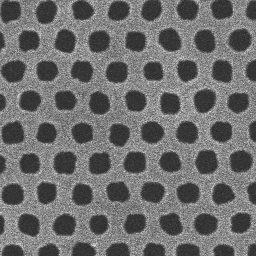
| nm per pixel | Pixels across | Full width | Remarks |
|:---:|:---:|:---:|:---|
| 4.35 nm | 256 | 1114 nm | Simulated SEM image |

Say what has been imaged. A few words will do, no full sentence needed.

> a regular array of holes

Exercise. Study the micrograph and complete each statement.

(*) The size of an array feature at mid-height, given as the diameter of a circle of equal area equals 96.3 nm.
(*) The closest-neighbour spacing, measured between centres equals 148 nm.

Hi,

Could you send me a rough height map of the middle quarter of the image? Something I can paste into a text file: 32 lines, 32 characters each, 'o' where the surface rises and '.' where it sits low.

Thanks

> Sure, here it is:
oo.....oooo.....oooo....oooo....
oo.....oooo.....oooo.....ooo....
oo.....ooo......oooo.....ooo....
oo.....oooo.....oooo.....oooo...
ooooo.oooooo..oooooooooooooooo.o
oooooooooooooooooooooooooooooooo
oooooooooooooooo..oooooooooooooo
..ooooo...oooooo....ooooo...oooo
...oooo....oooo.....oooo.....ooo
...ooo......ooo......ooo.....ooo
...ooo......oooo.....ooo.....ooo
..ooooo....oooooo...oooo.....ooo
oooooooo..ooooooooooooooo...oooo
oooooooooooooooooooooooooooooooo
ooooooooooooooooooooo..ooooooo..
oo.....ooooo....ooo.....ooooo...
oo.....ooooo.....oo......ooo....
oo.....ooooo.....oo......ooo....
oo.....oooo.....ooo......ooo....
ooo...oooooo....oooo....ooooo...
ooooooooooooo..ooooooooooooooooo
oooooooooooooooooooooooooooooooo
..ooooo....ooooo....oooo....oooo
...ooo.....oooo.....oooo.....ooo
...ooo......ooo.....oooo.....ooo
...ooo......ooo.....oooo.....ooo
...ooo.....oooo.....ooooo....ooo
..ooooo...oooooooooooooooooooooo
oooooooooooooooooooooooooooooooo
oooooooooooooo.ooooo..oooooooooo
ooo...ooooo....ooooo.....oooo...
oo.....ooo......ooo......ooo....